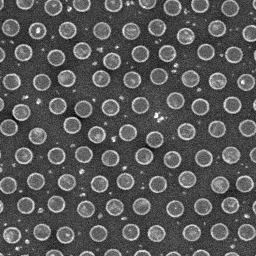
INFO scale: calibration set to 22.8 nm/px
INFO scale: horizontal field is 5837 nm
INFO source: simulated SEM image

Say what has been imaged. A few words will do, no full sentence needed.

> a regular array of raised bodies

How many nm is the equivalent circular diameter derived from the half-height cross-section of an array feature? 376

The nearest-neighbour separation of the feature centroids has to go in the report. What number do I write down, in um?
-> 0.589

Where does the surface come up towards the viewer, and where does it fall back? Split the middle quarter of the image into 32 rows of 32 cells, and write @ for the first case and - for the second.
----------@@@@------------------
----------------------@@@-------
@@------@@@-----@@----@@@@----@@
@@@----@@@@----@@@@---@@@@----@@
@@-----@@@@----@@@@---@@@-----@@
----------------@@-------------@
--------------------------------
---------------------------@@---
------------------@@------@@@@--
----@-----@@@----@@@@-----@@@@--
---@@@@---@@@@---@@@@------@@---
---@@@@---@@@@---@@@@-----------
---@@@@----@@-------------------
--@-----------------------------
@@@@----------------------------
@@@@-----------@@------------@@@
@@@@---@@@----@@@@-----------@@@
------@@@@----@@@@---@@@-----@@@
------@@@@-----@@----@@@@----@@@
-------@@------------@@@@-------
---------------------@@@--------
---@@@@------------@@-----------
---@@@@---@@@-----@@@@----@@----
---@@@@---@@@@----@@@@---@@@@---
----@@----@@@------@@@---@@@@---
--------------------------@@----
--------------------------------
---------------@-------------@@@
@@------@@----@@@-----@@@----@@@
@@@----@@@@--@@@@-----@@@@---@@@
@@@----@@@@---@@@-----@@@@----@@
--------@@------------@@@-------